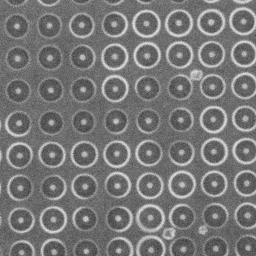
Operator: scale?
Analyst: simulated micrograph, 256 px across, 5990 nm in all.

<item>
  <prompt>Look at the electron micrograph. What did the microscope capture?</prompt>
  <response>an array of small figures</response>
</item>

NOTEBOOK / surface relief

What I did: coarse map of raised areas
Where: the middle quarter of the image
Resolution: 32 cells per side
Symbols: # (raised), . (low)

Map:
###....####....####...#####...##
################################
################################
####.######...#####...#####....#
###....###.....###.....###......
##......##......##......##......
##......##......##......##......
##......##.....###......###....#
###....####....####...######..##
################################
################################
############..######..######...#
###....####....####....####.....
##.....###......##......##......
##......##......##......##......
##.....###......###.....###.....
###....####....####....#####...#
################################
################################
#####.######..######..######..##
###....####.....###.....###.....
##......##......##......##......
##......##......##......##......
##......##......##......###.....
###....####....####....#####...#
####..#######.##################
################################
############..#######.######...#
###....####.....###.....###.....
##......###.....###.....###.....
##......##......##.......#......
##......###.....###.....###.....